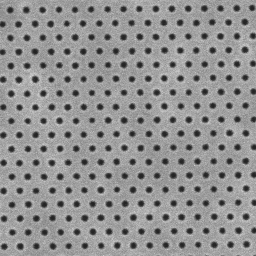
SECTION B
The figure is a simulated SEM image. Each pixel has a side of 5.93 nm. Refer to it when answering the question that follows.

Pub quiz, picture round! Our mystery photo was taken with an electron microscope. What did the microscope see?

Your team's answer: a regular array of holes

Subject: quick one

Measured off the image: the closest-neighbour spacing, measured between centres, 0.0935 micrometres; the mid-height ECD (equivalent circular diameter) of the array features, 41.8 nm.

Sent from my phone